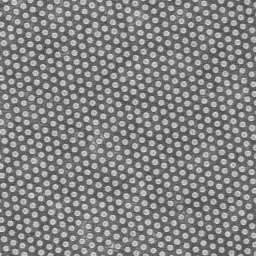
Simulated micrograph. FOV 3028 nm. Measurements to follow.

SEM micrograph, a regular array of raised bodies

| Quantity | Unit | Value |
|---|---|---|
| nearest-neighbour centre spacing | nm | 109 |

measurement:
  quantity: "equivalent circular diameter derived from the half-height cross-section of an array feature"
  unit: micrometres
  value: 0.0612